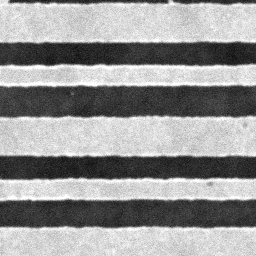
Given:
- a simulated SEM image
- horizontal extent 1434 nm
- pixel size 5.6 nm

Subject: lines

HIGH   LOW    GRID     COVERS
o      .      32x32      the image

.oooo.o.....ooooooo..oo..o......
oooooooooooooooooooooooooooooooo
oooooooooooooooooooooooooooooooo
oooooooooooooooooooooooooooooooo
oooooooooooooooooooooooooooooooo
................................
................................
................................
oooooooooooooooooooooooooooooooo
oooooooooooooooooooooooooooooooo
oooooooooooooooooooooooooooooooo
................................
................................
................................
................................
oooooooooooooooooooooooooooooooo
oooooooooooooooooooooooooooooooo
oooooooooooooooooooooooooooooooo
oooooooooooooooooooooooooooooooo
................................
................................
................................
o...oooooooooooooooooooooooooooo
oooooooooooooooooooooooooooooooo
oooooooooooooooooooooooooooooooo
................................
................................
................................
........o.........oo............
oooooooooooooooooooooooooooooooo
oooooooooooooooooooooooooooooooo
oooooooooooooooooooooooooooooooo